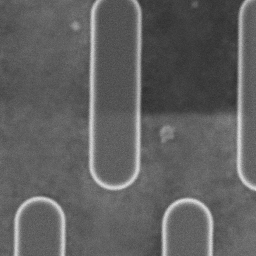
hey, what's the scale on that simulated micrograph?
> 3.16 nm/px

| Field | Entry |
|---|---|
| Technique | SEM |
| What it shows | groups of lines, slits or small figures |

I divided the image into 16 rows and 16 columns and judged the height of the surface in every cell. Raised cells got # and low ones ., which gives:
......###......#
......###......#
......###......#
......###......#
......###......#
......###......#
......###......#
......###......#
......###......#
......###......#
......###......#
......##.......#
..#........#....
.###......###...
.###......###...
.###......###...